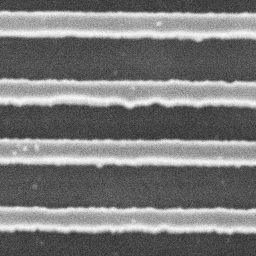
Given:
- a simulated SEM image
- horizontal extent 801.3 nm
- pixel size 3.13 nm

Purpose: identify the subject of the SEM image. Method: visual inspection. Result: lines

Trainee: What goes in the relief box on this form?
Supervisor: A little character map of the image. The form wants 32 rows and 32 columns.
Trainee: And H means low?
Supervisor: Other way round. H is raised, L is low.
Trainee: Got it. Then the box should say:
LLLLLLLLLLLLLLLLLLLLLLLLLLLLLLLL
HLLLLLLLLLLLLLLLLLLLLLLLLLLLLLLL
HHHHHHHHHHHHHHHHHHHHHHHHHHHHHHHH
HHHHHHHHHHHHHHHHHHHHHHHHHHHHHHHH
LLLLLLLLLLLLLLHLLLLLHLLLHHHHHLLH
LLLLLLLLLLLLLLLLLLLLLLLLLLLLLLLL
LLLLLLLLLLLLLLLLLLLLLLLLLLLLLLLL
LLLLLLLLLLLLLLLLLLLLLLLLLLLLLLLL
LLLLLLLLLLLLLLLLLLLLLLLLLLLLLLLL
LLLLLLLLLLLLLLLLLLLLLLLLLLLLLLLL
HHHHHHHHHHHHHHHHHHHHHHHHHHHHHHHH
HHHHHHHHHHHHHHHHHHHHHHHHHHHHHHHH
HHHHHHHHHHHHHHHHHHHHHHHHHHHHHHHH
LLLLLLLLLLLLLLLLLLLLLLLLLLLLLLLL
LLLLLLLLLLLLLLLLLLLLLLLLLLLLLLLL
LLLLLLLLLLLLLLLLLLLLLLLLLLLLLLLL
LLLLLLLLLLLLLLLLLLLLLLLLLLLLLLLL
HHHHLLLLLLLLLLLLLLLLLLLLLLLLLLLL
HHHHHHHHHHHHHHHHHHHHHHHHHHHHHHHH
HHHHHHHHHHHHHHHHHHHHHHHHHHHHHHHH
LLLLLLLLLLLLLLLLLLLLLLLLLLLLLLLL
LLLLLLLLLLLLLLLLLLLLLLLLLLLLLLLL
LLLLLLLLLLLLLLLLLLLLLLLLLLLLLLLL
LLLLLLLLLLLLLLLLLLLLLLLLLLLLLLLL
LLLLLLLLLLLLLLLLLLLLLLLLLLLLLLLL
LLLLLLLLLLLLLLLLLLLLLLLLLLLLLLLL
HHHHHHHHHHHHHHHHHHHHHHHHHHHHHHHH
HHHHHHHHHHHHHHHHHHHHHHHHHHHHHHHH
HHHHHHHHHHHHHHHHHHHHHHHHHHHHHHHH
LLLLLLLLLLLLLLLLLLLLLLLLLLLLLLLL
LLLLLLLLLLLLLLLLLLLLLLLLLLLLLLLL
LLLLLLLLLLLLLLLLLLLLLLLLLLLLLLLL